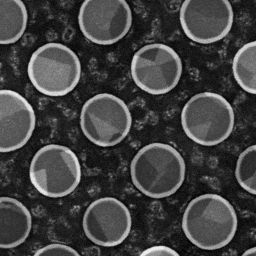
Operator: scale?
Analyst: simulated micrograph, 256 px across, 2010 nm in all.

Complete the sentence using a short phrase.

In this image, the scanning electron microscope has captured a regular array of raised bodies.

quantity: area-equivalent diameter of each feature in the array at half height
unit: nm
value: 384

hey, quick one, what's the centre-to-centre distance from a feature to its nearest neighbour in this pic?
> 0.565 um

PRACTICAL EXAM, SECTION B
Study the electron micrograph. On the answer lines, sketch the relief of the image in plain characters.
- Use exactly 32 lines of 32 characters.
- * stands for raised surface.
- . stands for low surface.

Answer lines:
***........*****.......*****....
***.......******.......******...
***.......******.......******...
***.......******.......******...
**.........****.........****....
................................
.....****........*****........**
....******.......*****.......***
....******.......*****.......***
....******.......*****........**
....*****........*****........**
*.....**...........*............
***........****.........****....
****.......*****.......******...
****......******.......******...
****......******.......******...
****.......*****.......******...
***.........***..........***....
**....**..........***...........
.....****........*****........**
....******.......******.......**
....******.......******.......**
....******.......******.......**
.....****........*****.........*
................................
**..........***.........****....
***........*****.......******...
****.......*****.......******...
****.......*****.......******...
***........*****........*****...
**...........*...........***....
.....****.........****.........*